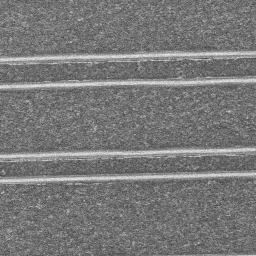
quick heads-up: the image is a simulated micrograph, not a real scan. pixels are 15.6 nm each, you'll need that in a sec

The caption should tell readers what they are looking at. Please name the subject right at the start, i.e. one or a few lines or trenches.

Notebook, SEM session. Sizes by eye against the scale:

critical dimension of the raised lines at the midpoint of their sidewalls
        0.396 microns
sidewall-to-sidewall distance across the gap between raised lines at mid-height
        1.09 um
